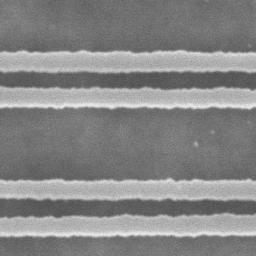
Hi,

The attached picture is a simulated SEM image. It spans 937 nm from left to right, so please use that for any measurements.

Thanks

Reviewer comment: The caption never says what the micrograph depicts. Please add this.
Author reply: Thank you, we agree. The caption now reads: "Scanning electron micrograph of lines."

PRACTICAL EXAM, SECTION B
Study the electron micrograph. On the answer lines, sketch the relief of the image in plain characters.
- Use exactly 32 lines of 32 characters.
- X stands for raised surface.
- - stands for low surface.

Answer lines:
--------------------------------
--------------------------------
--------------------------------
--------------------------------
--------------------------------
--------------------------------
--X-----X-X---XX---XXXXX--------
XXXXXXXXXXXXXXXXXXXXXXXXXXXXXXXX
XXXXXXXXXXXXXXXXXXXXXXXXXXXXXXXX
--------------------------------
--------------------------------
XXXXXXXXXXXXXXXXXXXXXXXXXXXXXXXX
XXXXXXXXXXXXXXXXXXXXXXXXXXXXXXXX
------------------------X-------
--------------------------------
--------------------------------
--------------------------------
--------------------------------
--------------------------------
--------------------------------
--------------------------------
--------------------------------
------XX-------------X--X-------
XXXXXXXXXXXXXXXXXXXXXXXXXXXXXXXX
XXXXXXXXXXXXXXXXXXXXXXXXXXXXXXXX
--------------------------------
--------------------------------
XXXXXXXXXXXXXXXXXXXXXXXXXXXXXXXX
XXXXXXXXXXXXXXXXXXXXXXXXXXXXXXXX
-------XX-------------X---------
--------------------------------
--------------------------------